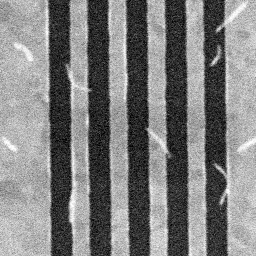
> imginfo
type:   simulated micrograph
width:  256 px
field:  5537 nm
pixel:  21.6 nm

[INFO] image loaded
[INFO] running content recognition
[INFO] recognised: groups of lines, slits or small figures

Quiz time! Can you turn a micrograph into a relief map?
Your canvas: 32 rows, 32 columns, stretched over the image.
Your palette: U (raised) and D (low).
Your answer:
UUUUUUDDDUUDDDUUDDDUDDDUUDDDUUUU
UUUUUUDDDUUDDDUUDDDUDDDUUDDDUUUU
UUUUUUDDDUUDDDUUDDDUUDDUUDDDUUUU
UUUUUUDDDUUDDDUUDDDUUDDUUDDDUUUU
UUUUUUDDDUUDDDUUDDDUUDDUUDDDUUUU
UUUUUUDDDUUDDDUUDDDUUDDUUDDDUUUU
UUUUUUDDDUUDDDUUDDDUUDDUUDDDUUUU
UUUUUUDDDUUDDDUUDDDUUDDUUDDDUUUU
UUUUUUDDDUUDDDUUDDDUUDDUUDDDUUUU
UUUUUUDDDUUDDDUUDDDUUDDDUDDDUUUU
UUUUUUDDDUUDDDUUDDDUUDDDUDDDUUUU
UUUUUUDDDUUDDDUUDDDUUDDDUDDDUUUU
UUUUUUDDDUUDDDUUDDDUUDDDUDDDUUUU
UUUUUUDDDUUDDDUUDDDUUDDDUDDDUUUU
UUUUUUDDDUUDDDUUDDDUUDDDUDDDUUUU
UUUUUUDDDUUDDDUUDDDUUDDDUDDDUUUU
UUUUUUDDDUUDDDUUDDDUUDDDUDDDUUUU
UUUUUUDDDUUDDDUUDDDUUDDDUDDDUUUU
UUUUUUDDDUUDDDUUDDDUUDDDUDDDUUUU
UUUUUUDDDUUDDDUUDDDUUDDDUDDDUUUU
UUUUUUDDDUUDDDUUDDDUUDDDUDDDUUUU
UUUUUUDDDUUDDDUUDDDUUDDDUUDDDUUU
UUUUUUDDDUUDDDUUDDDUUDDDUUDDUUUU
UUUUUUDDDUUDDDUUDDDUUDDDUUDDUUUU
UUUUUUDDDUUDDDUUDDDUUDDDUUDDUUUU
UUUUUUDDDUUDDDUUDDDUUDDDUUDDUUUU
UUUUUUDDDUUDDDUUDDDUUDDDUUDDUUUU
UUUUUUDDDUUDDDUUDDDUUDDDUUDDDUUU
UUUUUUDDDUUDDDUUDDDUUDDDUUDDDUUU
UUUUUUDDDUUDDDUUDDDUUDDDUUDDUUUU
UUUUUUDDDUUDDDUUDDDUUDDDUUDDDUUU
UUUUUUDDDUUDDDUUDDDUUDDDUUDDDUUU